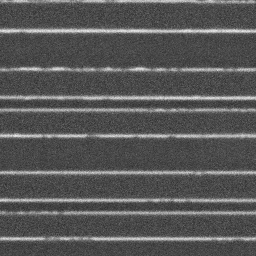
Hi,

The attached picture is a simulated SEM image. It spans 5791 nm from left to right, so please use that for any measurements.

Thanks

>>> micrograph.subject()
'lines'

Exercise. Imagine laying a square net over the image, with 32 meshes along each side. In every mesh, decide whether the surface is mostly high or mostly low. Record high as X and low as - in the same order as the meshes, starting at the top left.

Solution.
XXXXXXXXXXXXXXXXXXXXXXXXXXXXXXXX
XXXXXXXXXXXXXXXXXXXXXXXXXXXXXXXX
XXXXXXXXXXXXXXXXXXXXXXXXXXXXXXXX
XXXXXXXXXXXXXXXXXXXXXXXXXXXXXXXX
--------------------------------
--------------------------------
--------------------------------
--------------------------------
--------------------------------
XXXXXXXXXXXXXXXXXXXXXXXXXXXXXXXX
XXXXXXXXXXXXXXXXXXXXXXXXXXXXXXXX
XXXXXXXXXXXXXXXXXXXXXXXXXXXXXXXX
--------------------------------
--------------------------------
XXXXXXXXXXXXXXXXXXXXXXXXXXXXXXXX
XXXXXXXXXXXXXXXXXXXXXXXXXXXXXXXX
XXXXXXXXXXXXXXXXXXXXXXXXXXXXXXXX
--------------------------------
--------------------------------
--------------------------------
--------------------------------
--------------------------------
XXXXXXXXXXXXXXXXXXXXXXXXXXXXXXXX
XXXXXXXXXXXXXXXXXXXXXXXXXXXXXXXX
XXXXXXXXXXXXXXXXXXXXXXXXXXXXXXXX
--------------------------------
--------------------------------
XXXXXXXXXXXXXXXXXXXXXXXXXXXXXXXX
XXXXXXXXXXXXXXXXXXXXXXXXXXXXXXXX
XXXXXXXXXXXXXXXXXXXXXXXXXXXXXXXX
--------------------------------
--------------------------------